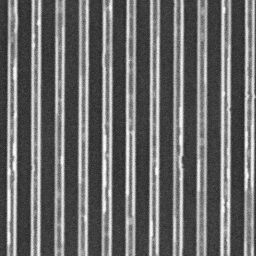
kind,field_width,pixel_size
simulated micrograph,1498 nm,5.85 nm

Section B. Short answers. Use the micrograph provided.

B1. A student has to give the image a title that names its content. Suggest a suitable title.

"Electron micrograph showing parallel lines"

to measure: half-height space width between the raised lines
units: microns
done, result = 0.0929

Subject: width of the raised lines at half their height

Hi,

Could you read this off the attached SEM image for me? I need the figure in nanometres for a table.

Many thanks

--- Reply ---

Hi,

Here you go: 46.8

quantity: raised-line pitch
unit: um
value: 0.139